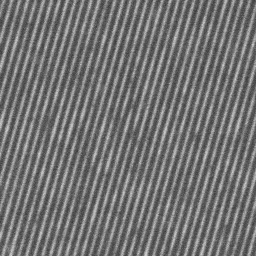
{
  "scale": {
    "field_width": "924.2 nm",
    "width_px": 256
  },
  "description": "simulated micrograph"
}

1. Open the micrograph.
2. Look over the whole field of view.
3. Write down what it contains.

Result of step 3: parallel lines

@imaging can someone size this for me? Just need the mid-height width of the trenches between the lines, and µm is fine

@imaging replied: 0.023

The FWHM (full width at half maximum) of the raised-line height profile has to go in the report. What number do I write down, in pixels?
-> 1.33